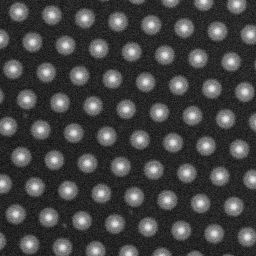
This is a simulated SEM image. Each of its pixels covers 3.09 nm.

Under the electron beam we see an array of small figures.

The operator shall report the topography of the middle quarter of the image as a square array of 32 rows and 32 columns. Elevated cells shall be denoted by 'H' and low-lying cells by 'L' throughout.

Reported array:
LLLLLLLLLLLLLLLLLLLLLLLLLLLLLLLL
LLHHHHLLLLLLLLLLLLLLLLLLLLLLLLLL
LLHHHHLLLLHHHHLLLLLHHHLLLLLLLLLL
LLHHHHLLLLHHHHLLLLHHHHLLLLLHHHLL
LLHHHHLLLLHHHHLLLLHHHHHLLLLHHHHL
LLLLLLLLLLLHHHLLLLHHHHHLLLHHHHHL
LLLLLLLLLLLLLLLLLLLHHHLLLLLHHHHL
LLLLLLLLLLLLLLLLLLLLLLLLLLLLHHLL
HLLLLLHHHLLLLLLLLLLLLLLLLLLLLLLL
HLLLLHHHHLLLLLHHHLLLLLLLLLLLLLLL
HLLLLHHHHLLLLHHHHHLLLLHHHLLLLLLL
HLLLLHHHHLLLLHHHHHLLLLHHHHLLLLHH
LLLLLLHHLLLLLLHHHLLLLLHHHHLLLLHH
LLLLLLLLLLLLLLLHLLLLLLHHHHLLLLHH
LLLLLLLLLLLLLLLLLLLLLLLLLLLLLLHH
LHHHLLLLLLLLLLLLLLLLLLLLLLLLLLLL
HHHHHLLLLHHHLLLLLLLLLLLLLLLLLLLL
HHHHHLLLHHHHHLLLLHHHHLLLLLLHLLLL
HHHHLLLLHHHHHLLLLHHHHLLLLHHHHLLL
LLHLLLLLLHHHHLLLLHHHHLLLLHHHHHLL
LLLLLLLLLLLLLLLLLHHHHLLLLHHHHHLL
LLLLLLLLLLLLLLLLLLLLLLLLLLHHHLLL
LLLLLLLLLLLLLLLLLLLLLLLLLLLLLLLL
LLLLHHHHLLLLLHHLLLLLLLLLLLLLLLLL
LLLLHHHHLLLLHHHHLLLLLHHHLLLLLLLL
LLLLHHHHLLLLHHHHHLLLHHHHHLLLLHHH
LLLLHHHLLLLLHHHHLLLLHHHHHLLLHHHH
LLLLLLLLLLLLLHHHLLLLHHHHHLLLHHHH
LLLLLLLLLLLLLLLLLLLLLHHHLLLLLHHH
HHLLLLLLLLLLLLLLLLLLLLLLLLLLLLHH
HHHLLLLLHHHLLLLLLLLLLLLLLLLLLLLL
HHHLLLLHHHHHLLLLHHHLLLLLLLLLLLLL